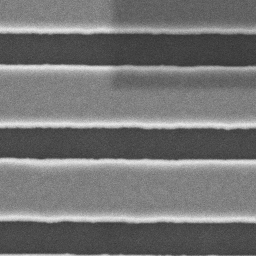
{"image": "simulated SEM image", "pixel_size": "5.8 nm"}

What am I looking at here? lines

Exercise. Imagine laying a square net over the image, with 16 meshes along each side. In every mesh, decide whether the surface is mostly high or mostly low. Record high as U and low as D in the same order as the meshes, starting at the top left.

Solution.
UUUUUUUUUUUUUUUU
UUUUUUUUUUUUUUUU
DDDDDDDDDDDDDDDD
DDDDDDDDDDDDDDDD
UUUUUUUUUUUUUUUU
UUUUUUUUUUUUUUUU
UUUUUUUUUUUUUUUU
UUUUUUUUUUUUUUUU
DDDDDDDDDDDDDDDD
DDDDDDDDDDDDDDDD
UUUUUUUUUUUUUUUU
UUUUUUUUUUUUUUUU
UUUUUUUUUUUUUUUU
UUUUUUUUUUUUUUUU
DDDDDDDDDDDDDDDD
DDDDDDDDDDDDDDDD